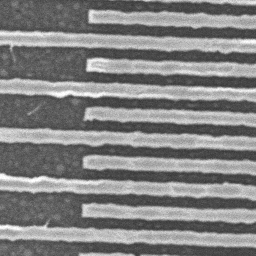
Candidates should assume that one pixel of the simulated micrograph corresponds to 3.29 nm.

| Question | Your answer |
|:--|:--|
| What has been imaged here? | parallel lines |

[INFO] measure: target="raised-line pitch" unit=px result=24.2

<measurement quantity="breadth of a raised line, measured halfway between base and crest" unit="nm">42.3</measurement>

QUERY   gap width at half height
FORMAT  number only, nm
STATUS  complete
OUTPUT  39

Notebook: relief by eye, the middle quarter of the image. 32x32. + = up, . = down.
......++++++++++++++++++++++++++
......++++++++++++++++++++++++++
........................+++...++
................................
..+.............................
++++++++++++++++++++++++........
++++++++++++++++++++++++++++++++
++++++++++++++++++++++++++++++++
..................++.....+++++++
................................
................................
......++++++++++.+++.++++.......
......++++++++++++++++++++++++++
......++++++++++++++++++++++++++
..............+...........++++++
................................
................................
++++++++++++++++++++.....+....+.
++++++++++++++++++++++++++++++++
++++++++++++++++++++++++++++++++
.................+...+++++++++++
................................
................................
.....++++++++++.+++++...........
.....+++++++++++++++++++++++++++
.....+++++++++++++++++++++++++++
.........+.......+...+++++++++++
................................
................................
++++++++++++++++++++++..........
++++++++++++++++++++++++++++++++
++++++++++++++++++++++++++++++++